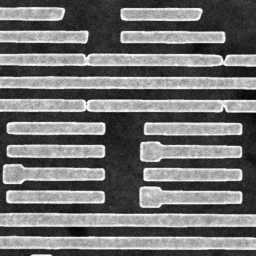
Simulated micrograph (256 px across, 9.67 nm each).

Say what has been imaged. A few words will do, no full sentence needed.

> wiring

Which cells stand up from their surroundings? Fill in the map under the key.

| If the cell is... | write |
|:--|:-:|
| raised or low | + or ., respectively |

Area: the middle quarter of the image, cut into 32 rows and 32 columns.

................................
................................
................................
++.....++++.....................
++++++++++++++++++++++++++++++++
++++++++++++++++++++++++++++++++
................................
................................
................................
+++++.++++++++++++++++++++++++++
++++++++++++++++++++++++++++++++
+++++.++++++++++++++++++++++++++
................................
................................
................................
++++++++++..........++++++++++++
++++++++++..........++++++++++++
........++..........++++++++++++
................................
................................
++++++++++.........+++++++++++++
++++++++++.........+++++++++++++
++++++++++.........+++++++++++++
...................++++++.......
................................
................................
++++++++++..........++++++++++++
++++++++++..........++++++++++++
++++++++++..........++++++++++++
................................
................................
...................+++++........